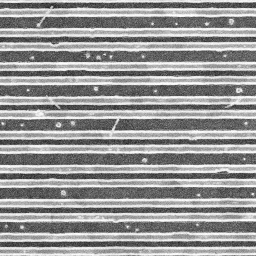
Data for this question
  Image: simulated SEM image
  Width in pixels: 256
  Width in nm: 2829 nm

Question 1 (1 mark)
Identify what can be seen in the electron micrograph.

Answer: parallel lines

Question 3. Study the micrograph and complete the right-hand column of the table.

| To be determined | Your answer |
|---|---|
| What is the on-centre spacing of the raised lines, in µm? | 0.189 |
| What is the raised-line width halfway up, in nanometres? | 69.1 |